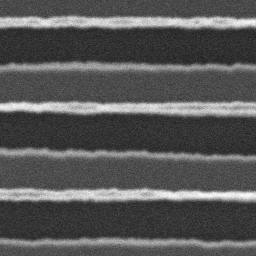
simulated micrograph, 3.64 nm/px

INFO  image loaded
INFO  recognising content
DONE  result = lines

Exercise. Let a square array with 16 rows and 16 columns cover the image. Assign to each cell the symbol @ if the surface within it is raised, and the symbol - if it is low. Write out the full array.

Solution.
@@@@@@@@@@@@@@@@
@@@@@@@@@@@@@@@@
----------------
----------------
@@@@@@@@@@@@@@@@
@@@@@@@@@@@@@@@@
@@@@@@@@@@@@@@@@
----------------
----------------
@@@-------------
@@@@@@@@@@@@@@@@
@@@@@@@@@@@@@@@@
----------------
----------------
----------------
@@@@@@@@@@@@@@@@